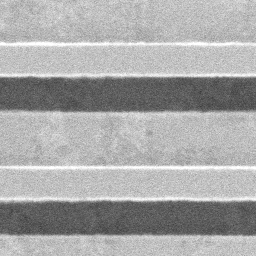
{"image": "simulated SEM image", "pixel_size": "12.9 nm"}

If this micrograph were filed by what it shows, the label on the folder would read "lines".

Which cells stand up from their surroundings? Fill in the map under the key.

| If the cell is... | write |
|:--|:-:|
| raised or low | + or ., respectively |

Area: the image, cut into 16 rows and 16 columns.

++++++++++++++++
++++++++++++++++
++++++++++++++++
++++++++++++++++
++++++++++++++++
................
................
++++++++++++++++
++++++++++++++++
++++++++++++++++
++++++++++++++++
++++++++++++++++
++++++++++++++++
................
................
++++++++++++++++